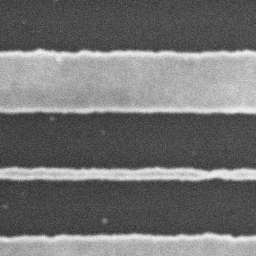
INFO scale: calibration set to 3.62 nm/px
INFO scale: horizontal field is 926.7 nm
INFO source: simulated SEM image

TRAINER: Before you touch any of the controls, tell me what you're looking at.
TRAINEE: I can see lines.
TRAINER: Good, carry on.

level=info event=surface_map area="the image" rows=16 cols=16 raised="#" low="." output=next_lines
................
................
................
################
################
################
################
................
................
................
................
................
................
................
................
################